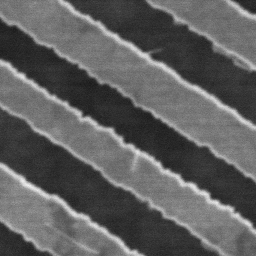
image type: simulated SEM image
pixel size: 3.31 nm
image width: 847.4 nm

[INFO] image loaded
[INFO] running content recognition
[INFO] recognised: lines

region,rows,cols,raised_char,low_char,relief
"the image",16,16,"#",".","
#####.....#####.
.#####.....#####
..######.....###
....#####......#
#....######.....
###....#####....
####....######..
..####....#####.
...####.....####
....#####....###
#.....####.....#
##.....#####....
####.....####...
#####.....#####.
.######.....####
..######.....###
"